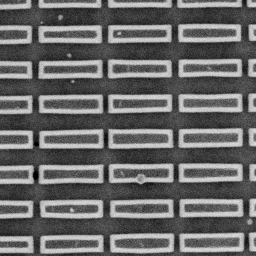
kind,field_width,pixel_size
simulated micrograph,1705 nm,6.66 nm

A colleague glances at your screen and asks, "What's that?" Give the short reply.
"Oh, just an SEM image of wiring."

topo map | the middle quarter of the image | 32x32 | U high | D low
UUUUUUUUUDDDUUUUUUUUUUUUUUDDDUUU
UUUUUUUUUDDDUUUUUUUUUUUUUUDDDUUU
UUUUUUUUUDDDUUUUUUUUUUUUUUDDDUUU
DDDDDDDDDDDDDDDDDDDDDDDDDDDDDDDD
DDDDDDDDDDDDDDDDDDDDDDDDDDDDDDDD
DDDDDDDDDDDDDDDDDDDDDDDDDDDDDDDD
DDDDDDDDDDDDDDDDDDDDDDDDDDDDDDDD
DDDDDDDDDDDDDDDDDDDDDDDDDDDDDDDD
UUUUUUUUUDDDUUUUUUUUUUUUUUDDDUUU
UUUUUUUUUDDDUUUUUUUUUUUUUUDDDUUU
UUUUUUUUUDDDUUUUUUUUUUUUUUDDDUUU
UUUUUUUUUDDDUUUUUUUUUDDDDDDDDDDD
DDDDDDDDDDDDDDDDDDDDDDDDDDDDDDDD
DDDDDDDDDDDDDDDDDDDDDDDDDDDDDDDD
DDDDDDDDDDDDDDDDDDDDDDDDDDDDDDDD
DDDDDDDDDDDDDDDDDDDDDDDDDDDDDDDD
DDDDDDDDDDDDDDDDDDDDDDDDDDDDDDDD
UUUUUUUUUDDDUUUUUUUUUUUUUUUDDUUU
UUUUUUUUUDDDUUUUUUUUUUUUUUUDDUUU
UUUUUUUUUDDDUUUUUUUUUUUUUUUDDUUU
DDDDDDDDDDDDUUUUDDDDDDDDDDDDDDDD
DDDDDDDDDDDDDDDDDDDDDDDDDDDDDDDD
DDDDDDDDDDDDDDDDDDDDDDDDDDDDDDDD
DDDDDDDDDDDDDDDDDDDDDDDDDDDDDDDD
DDDDDDDDDDDDDDDDDDDDDDDDDDDDDDDD
DDDDDDDDDDDDDDDDDDDDDDDDDDDDDDDD
UUUUUUUUUDDDUUUUUUUUUUUUUUUDDUUU
UUUUUUUUUDDDUUUUUUUUUUUUUUUDDUUU
UUUUUUUUUDDDUUUUUUUUUUUUUUUDDUUU
DDDDDDDDDDDDDDDDDDUUDDDDDDDDDDDD
DDDDDDDDDDDDDDDDDDDDDDDDDDDDDDDD
DDDDDDDDDDDDDDDDDDDDDDDDDDDDDDDD